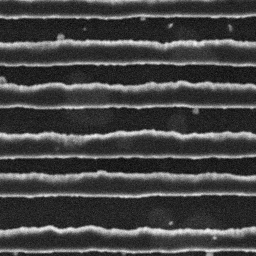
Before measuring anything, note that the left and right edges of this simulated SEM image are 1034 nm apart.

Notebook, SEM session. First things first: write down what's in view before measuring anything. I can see lines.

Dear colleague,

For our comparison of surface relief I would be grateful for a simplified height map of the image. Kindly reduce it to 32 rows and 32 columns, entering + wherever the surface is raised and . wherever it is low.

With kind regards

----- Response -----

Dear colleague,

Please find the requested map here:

++++++++++++++++++++++++++++++++
++++++++++++++++++++++++++++++++
................................
................................
................................
..++..++++++++++++++.+++++++++++
++++++++++++++++++++++++++++++++
++++++++++++++++++++++++++++++++
................................
................................
......................++.+......
++++++++++++++++++++++++++++++++
++++++++++++++++++++++++++++++++
....+++++++......+..........+..+
................................
................................
.................+++............
++++++++++++++++++++++++++++++++
++++++++++++++++++++++++++++++++
++++++++++++++++++++++++++++++++
................................
................................
++++++++++++++++++++++++++++++++
++++++++++++++++++++++++++++++++
+++++++..++++++++++....+........
................................
................................
................................
......+....+....................
++++++++++++++++++++++++++++++++
++++++++++++++++++++++++++++++++
...++++...+...+++++.+++.........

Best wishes